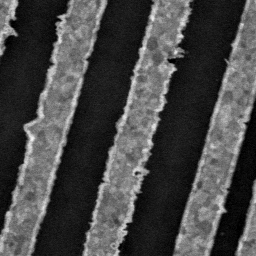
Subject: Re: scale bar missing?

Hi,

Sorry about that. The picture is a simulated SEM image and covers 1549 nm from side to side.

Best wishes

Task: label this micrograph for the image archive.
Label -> one or a few lines or trenches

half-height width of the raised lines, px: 31.7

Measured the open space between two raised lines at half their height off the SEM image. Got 315 nm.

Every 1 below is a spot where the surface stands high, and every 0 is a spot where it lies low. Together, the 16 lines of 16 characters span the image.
1000110000110001
1000110001100001
0000110001100001
0001100001100011
0001100011100011
0001100011000011
0001100011000011
0011000011000110
0011000110000110
0011000110000110
0110000110001100
0110001110001100
0110001100001100
0110001100001100
1100001100011001
1100011000011001